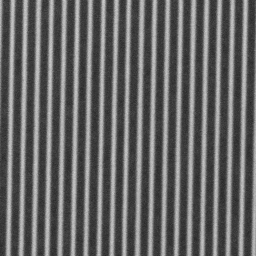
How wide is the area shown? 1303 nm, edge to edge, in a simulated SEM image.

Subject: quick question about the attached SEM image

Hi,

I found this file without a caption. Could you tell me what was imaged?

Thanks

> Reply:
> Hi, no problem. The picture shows parallel lines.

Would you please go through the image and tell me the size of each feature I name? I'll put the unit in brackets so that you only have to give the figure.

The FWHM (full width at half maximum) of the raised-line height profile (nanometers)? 18.5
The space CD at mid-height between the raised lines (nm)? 45.8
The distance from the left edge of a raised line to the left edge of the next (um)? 0.0658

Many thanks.